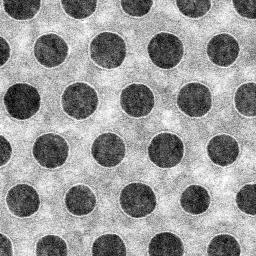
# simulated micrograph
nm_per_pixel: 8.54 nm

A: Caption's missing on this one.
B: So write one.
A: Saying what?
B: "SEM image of a regular array of raised bodies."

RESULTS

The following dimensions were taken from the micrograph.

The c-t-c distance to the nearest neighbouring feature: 488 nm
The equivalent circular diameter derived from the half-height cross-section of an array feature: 36.8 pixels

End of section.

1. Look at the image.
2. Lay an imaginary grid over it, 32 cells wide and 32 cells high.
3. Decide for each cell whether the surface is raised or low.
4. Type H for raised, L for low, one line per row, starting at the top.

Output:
HHHHHLLLHHHHLLLHHHHLLLHHHHLLLHHH
LHHHHLLLHHHHLLLHHHHLLLHHHHLLLLHH
LLHHLLLLLLLLLLLLLLLLLLLLLLLLLLLH
LLLLLLLLLLLLLLLLLLLLLLLLLLLLLLLL
LLLLLHHHLLLLHHHLLLLHHHLLLLLHHLLL
HLLLHHHHLLLHHHHHLLHHHHHLLLHHHHLL
HLLLHHHHHLLHHHHHLLHHHHHLLLHHHHLL
HLLLLHHHLLLHHHHHLLLHHHHLLLHHHHLL
LLLLLLHLLLLLLHHLLLLLHHLLLLLLLLLL
LLLLLLLLLLLLLLLLLLLLLLLLLLLLLLLL
LLHHLLLLLHHLLLLLHHLLLLLHHLLLLLHH
LHHHHLLLHHHHLLLHHHHLLLHHHHLLLHHH
HHHHHLLLHHHHLLLHHHHLLLHHHHHLLHHH
LHHHHLLLHHHHLLLHHHHLLLHHHHLLLHHH
LHHHLLLLLHHLLLLLHHLLLLLHHLLLLLHH
LLLLLLLLLLLLLLLLLLLLLLLLLLLLLLLL
LLLLLLLHLLLLLHLLLLLLLLLLLLLLLLLL
HLLLHHHHLLLLHHHLLLLHHHHLLLHHHHLL
HHLLHHHHHLLHHHHHLLHHHHHLLLHHHHLL
HLLLHHHHHLLHHHHHLLHHHHHLLLHHHHLL
HLLLLHHHLLLLHHHLLLLHHHLLLLLHHLLL
LLLLLLLLLLLLLLLLLLLLLLLLLLLLLLLL
LLLLLLLLLLLLLLLLLLLLLLLLLLLLLLLL
LHHHLLLLLHHLLLLHHHHLLLLHHHLLLLHH
LHHHHLLLHHHHLLLHHHHLLLLHHHLLLHHH
LHHHHLLLHHHHLLLHHHHHLLHHHHLLLHHH
LHHHHLLLLHHLLLLHHHHLLLLHHHLLLLHH
LLLLLLLLLLLLLLLLLLLLLLLLLLLLLLLL
LLLLLLLLLLLLLLLLLLLLLLLLLLLLLLLL
HLLLLHHLLLLLHHHLLLLHHHLLLLLHHLLL
HHLLHHHHLLLLHHHHLLLHHHHLLLHHHHLL
HHLLHHHHHLLHHHHHLLHHHHHLLLHHHHLL